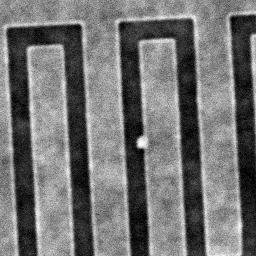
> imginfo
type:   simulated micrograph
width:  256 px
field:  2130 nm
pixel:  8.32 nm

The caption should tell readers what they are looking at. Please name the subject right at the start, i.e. groups of lines, slits or small figures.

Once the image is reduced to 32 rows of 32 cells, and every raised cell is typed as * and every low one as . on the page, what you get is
********************************
********************************
****************........*****...
*.........*****.........*****...
*.........*****.........*****...
*..........****...****...****..*
*...****...****...****...****...
*...****...****...****...****...
*...****...****...****...****...
*...****...****...****...****...
*...****...****...****...****...
*...****...****...****...****...
*...****...****...****...****...
*...****...****...****...****...
*...****...****...****...****...
*...****...****...****...****...
*...****...****...****...****...
*...****...****..*****...****...
*...****...****...****...****...
*...*****..****...*****..****...
*...*****..*****..*****..*****..
**..*****..*****..*****..*****..
**..*****..*****..*****..*****..
**..*****..*****..*****..*****..
**...****..*****...****..*****..
**...****...****...****...****..
**...****...****...****...****..
**...****...****...****...****..
**...****...****...****...****..
**...****...****...****...****..
**...****...****...****...****..
**...****...****...****...****..